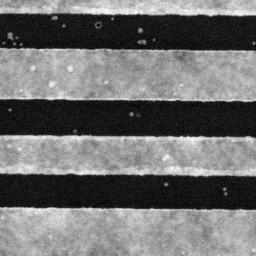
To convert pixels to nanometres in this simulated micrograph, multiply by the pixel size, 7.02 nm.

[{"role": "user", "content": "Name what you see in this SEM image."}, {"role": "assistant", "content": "lines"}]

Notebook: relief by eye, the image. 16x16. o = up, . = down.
oooooooooooooooo
................
................
oooooooooooooooo
oooooooooooooooo
oooooooooooooooo
................
................
................
oooooooooooooooo
oooooooooooooooo
................
................
oooooooooooooooo
oooooooooooooooo
oooooooooooooooo